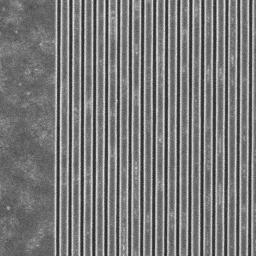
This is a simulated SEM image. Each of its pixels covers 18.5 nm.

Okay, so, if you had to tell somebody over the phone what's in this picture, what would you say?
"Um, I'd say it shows parallel lines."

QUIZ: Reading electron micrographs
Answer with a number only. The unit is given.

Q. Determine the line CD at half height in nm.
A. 139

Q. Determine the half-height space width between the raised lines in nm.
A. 85.5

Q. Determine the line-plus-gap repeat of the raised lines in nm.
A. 222